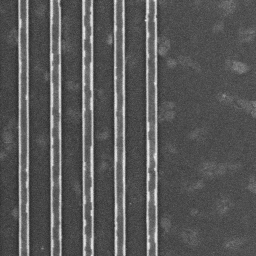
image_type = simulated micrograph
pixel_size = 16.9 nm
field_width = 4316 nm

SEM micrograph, parallel lines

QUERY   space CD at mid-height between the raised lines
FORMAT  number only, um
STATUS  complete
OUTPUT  0.39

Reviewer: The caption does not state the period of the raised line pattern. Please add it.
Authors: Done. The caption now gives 540 nm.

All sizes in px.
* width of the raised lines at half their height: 9.25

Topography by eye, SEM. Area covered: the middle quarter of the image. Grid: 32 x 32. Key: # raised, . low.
.....##......##......##.........
.....##......##......##.........
.....##......##......##.........
.....##......##......##.........
.....##......##......##.........
.....##......##......##.........
.....##......##......##.........
.....##......##......##.........
.....##......##......##.........
.....##......##......##.........
.....##......##......##.........
.....##......##......##.........
.....##......##......##.........
.....##......##......##.........
.....##......##......##.........
.....##......##......##.........
.....##......##......##.........
.....##......##......##.........
.....##......##......##.........
.....##......##......##.........
.....##......##......##.........
.....##......##......##.........
.....##......##......##.........
.....##......##......##.........
.....##......##......##.........
.....##......##......##.........
.....##......##......##.........
.....##......##......##.........
.....##......##......##.........
.....##......##......##.........
.....##......##......##.........
.....##......##......##.........